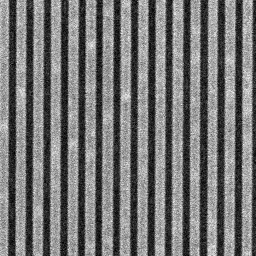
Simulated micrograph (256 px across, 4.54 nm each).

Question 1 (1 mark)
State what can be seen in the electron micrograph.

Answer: parallel lines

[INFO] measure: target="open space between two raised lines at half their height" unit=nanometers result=32.4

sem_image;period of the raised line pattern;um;0.0791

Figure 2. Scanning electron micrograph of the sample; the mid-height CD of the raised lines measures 0.0443 um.